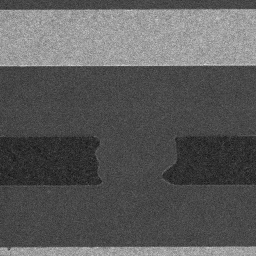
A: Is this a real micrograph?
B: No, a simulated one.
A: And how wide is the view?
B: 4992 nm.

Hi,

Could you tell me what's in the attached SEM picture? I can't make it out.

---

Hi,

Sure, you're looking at one or a few lines or trenches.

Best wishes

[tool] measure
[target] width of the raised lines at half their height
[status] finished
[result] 1.08 microns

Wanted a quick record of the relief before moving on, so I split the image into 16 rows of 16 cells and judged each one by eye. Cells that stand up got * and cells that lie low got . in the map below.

................
****************
****************
****************
................
................
................
................
................
******.....*****
******.....*****
******.....*****
................
................
................
..**************